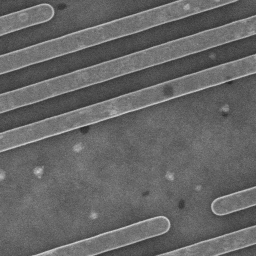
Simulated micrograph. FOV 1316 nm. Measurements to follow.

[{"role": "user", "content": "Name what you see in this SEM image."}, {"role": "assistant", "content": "groups of lines, slits or small figures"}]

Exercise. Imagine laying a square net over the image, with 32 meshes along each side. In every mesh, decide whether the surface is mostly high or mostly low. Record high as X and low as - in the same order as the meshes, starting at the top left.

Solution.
---------------------XXXXXXX----
--XXXXX-----------XXXXXXX-------
XXXXXX---------XXXXXXX--------XX
XXX--------XXXXXXXX--------XXXXX
--------XXXXXXX---------XXXXXXX-
-----XXXXXXX--------XXXXXXXX----
--XXXXXXX--------XXXXXXXX-------
XXXXXX--------XXXXXXXX--------XX
XX---------XXXXXXX--------XXXXXX
-------XXXXXXXX--------XXXXXXXX-
----XXXXXXXX--------XXXXXXX-----
-XXXXXXXX--------XXXXXXX--------
XXXXX---------XXXXXXX-----------
XX--------XXXXXXXX--------------
-------XXXXXXXX-----------------
----XXXXXXX---------------------
-XXXXXXX------------------------
XXXXX---------------------------
XX------------------------------
--------------------------------
--------------------------------
--------------------------------
--------------------------------
-------------------------------X
----------------------------XXXX
---------------------------XXXXX
---------------------------XX---
------------------XXX-----------
---------------XXXXXX----------X
------------XXXXXXXX--------XXXX
---------XXXXXXX---------XXXXXXX
------XXXXXXX--------XXXXXXX----